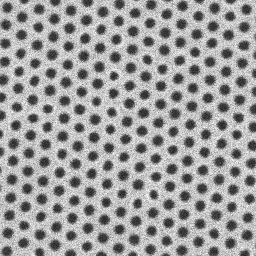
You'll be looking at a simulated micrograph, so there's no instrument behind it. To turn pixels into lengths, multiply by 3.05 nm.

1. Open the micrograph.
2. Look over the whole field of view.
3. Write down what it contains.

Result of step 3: a regular array of holes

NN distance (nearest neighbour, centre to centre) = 53.6 nm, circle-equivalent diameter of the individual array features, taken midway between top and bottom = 10.4 pixels